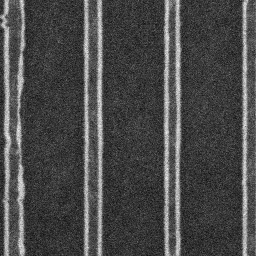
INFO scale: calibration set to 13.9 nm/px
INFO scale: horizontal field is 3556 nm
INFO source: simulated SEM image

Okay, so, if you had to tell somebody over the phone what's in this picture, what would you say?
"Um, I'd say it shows one or a few lines or trenches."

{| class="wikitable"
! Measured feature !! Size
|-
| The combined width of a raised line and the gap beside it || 1100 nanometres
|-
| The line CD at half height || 194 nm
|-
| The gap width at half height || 917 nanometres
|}